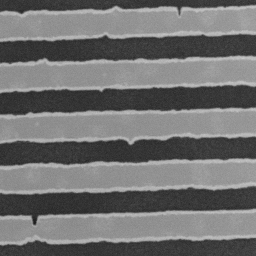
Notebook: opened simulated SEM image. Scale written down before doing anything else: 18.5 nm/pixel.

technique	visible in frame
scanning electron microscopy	parallel lines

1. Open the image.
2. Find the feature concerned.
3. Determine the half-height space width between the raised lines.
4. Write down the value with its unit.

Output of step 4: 467 nanometres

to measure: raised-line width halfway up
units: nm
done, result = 483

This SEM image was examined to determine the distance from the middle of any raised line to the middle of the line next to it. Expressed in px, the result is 51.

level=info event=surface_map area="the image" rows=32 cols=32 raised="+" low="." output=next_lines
................................
....++...+++.+++++++++++++++++++
++++++++++++++++++++++++++++++++
++++++++++++++++++++++++++++++++
+++++++++++++.+++...............
................................
................................
.......................+++++++++
++++++++++++++++++++++++++++++++
++++++++++++++++++++++++++++++++
++++++++++++++++++++++++++++...+
................................
................................
................................
...+++++++++++++++++++++++++++++
++++++++++++++++++++++++++++++++
++++++++++++++++++++++++++++++++
+++++++..+++....+...............
................................
................................
............+.+++.++++++++++++++
++++++++++++++++++++++++++++++++
++++++++++++++++++++++++++++++++
++++++++++++++++++++......+.....
................................
................................
......................+.++..++++
++++.+++++++++++++++++++++++++++
++++++++++++++++++++++++++++++++
++++++++++++++++++++++++++++++++
..+.............................
................................